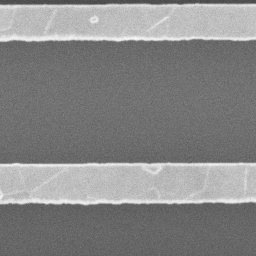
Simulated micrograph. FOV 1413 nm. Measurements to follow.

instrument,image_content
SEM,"lines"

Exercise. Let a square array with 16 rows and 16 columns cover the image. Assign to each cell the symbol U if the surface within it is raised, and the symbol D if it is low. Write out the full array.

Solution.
UUUUUUUUUUUUUUUU
UUUUUUUUUUUUUUUU
UUUDDDDUDDDDDDDD
DDDDDDDDDDDDDDDD
DDDDDDDDDDDDDDDD
DDDDDDDDDDDDDDDD
DDDDDDDDDDDDDDDD
DDDDDDDDDDDDDDDD
DDDDDDDDDDDDDDDD
DDDDDDDDDDDDDDDD
UUUUUUUUUUUUUUUU
UUUUUUUUUUUUUUUU
UUUUUUUUUUUUUUUU
DDDDDDDDDDDDDDDD
DDDDDDDDDDDDDDDD
DDDDDDDDDDDDDDDD